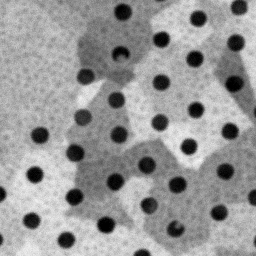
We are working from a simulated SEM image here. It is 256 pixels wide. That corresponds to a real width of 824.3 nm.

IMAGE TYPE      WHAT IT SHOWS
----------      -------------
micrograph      a regular array of holes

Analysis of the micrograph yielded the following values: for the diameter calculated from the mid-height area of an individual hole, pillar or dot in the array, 63.6 nm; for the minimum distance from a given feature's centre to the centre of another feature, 0.126 microns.